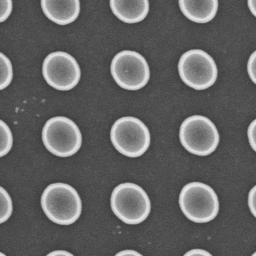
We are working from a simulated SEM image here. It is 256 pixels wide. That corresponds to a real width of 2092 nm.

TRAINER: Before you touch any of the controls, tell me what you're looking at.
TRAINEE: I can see a regular array of raised bodies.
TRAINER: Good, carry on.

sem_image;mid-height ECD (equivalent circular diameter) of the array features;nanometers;296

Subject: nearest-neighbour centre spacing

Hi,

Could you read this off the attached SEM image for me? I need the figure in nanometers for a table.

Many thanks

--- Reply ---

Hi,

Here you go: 541